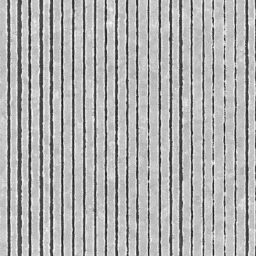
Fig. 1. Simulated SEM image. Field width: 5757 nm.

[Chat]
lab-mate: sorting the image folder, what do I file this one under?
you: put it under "parallel lines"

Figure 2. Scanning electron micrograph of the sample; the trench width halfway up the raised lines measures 75.9 nm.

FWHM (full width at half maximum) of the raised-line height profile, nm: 172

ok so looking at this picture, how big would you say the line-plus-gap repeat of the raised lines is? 243 nm